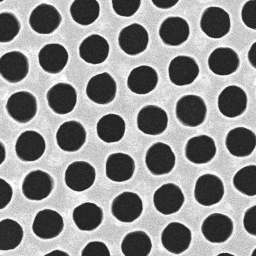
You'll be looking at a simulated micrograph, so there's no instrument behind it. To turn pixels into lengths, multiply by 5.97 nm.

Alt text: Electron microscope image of a regular array of holes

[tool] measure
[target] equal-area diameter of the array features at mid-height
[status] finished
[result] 0.178 micrometres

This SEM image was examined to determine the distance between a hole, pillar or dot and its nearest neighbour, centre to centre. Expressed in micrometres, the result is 0.238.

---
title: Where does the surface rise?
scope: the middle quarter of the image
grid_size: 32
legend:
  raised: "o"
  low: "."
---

ooooooooooooooooooo..ooooo......
ooooooooooooooooo......ooo......
ooooooooo..ooooo.......ooo......
ooooooo.....oooo.......ooo......
oooooo.......ooo.......oooo.....
..oooo.......ooo.......ooooooooo
...ooo.......oooo.....oooooooooo
...ooo.......ooooo..oooooooooooo
...ooo......oooooooooooooooooo..
...ooooo...ooooooooooooooooo....
...oooooooooooooooooo..ooooo....
..ooooooooooooooooo......ooo....
ooooooooooo..oooooo.......oo....
ooooooooo.....oooo........ooo...
o..ooooo.......ooo........oooo..
....oooo.......ooo........oooooo
.....ooo.......oooo......ooooooo
.....ooo.......ooooo...ooooooooo
.....oooo......ooooooooooooooooo
.....ooooo...oooooooooooooooooo.
....oooooooooooooooooo....ooooo.
...oooooooooooooooooo......oooo.
oooooooooooo...oooooo.......oo..
ooooooooooo......ooo........ooo.
oo...oooooo.......oo........oooo
o......ooo........ooo......ooooo
........oo.......oooo......ooooo
........ooo......oooooo.oooooooo
........ooo......ooooooooooooooo
.......ooooooooooooooooooooooooo
o......ooooooooooooooooo....oooo
oo...oooooooooooooooooo......ooo